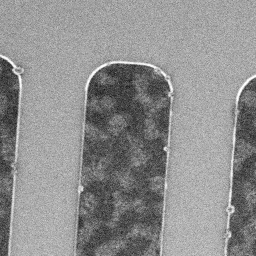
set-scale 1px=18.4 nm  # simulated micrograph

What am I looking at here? one or a few lines or trenches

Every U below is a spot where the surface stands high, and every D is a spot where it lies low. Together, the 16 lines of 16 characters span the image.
DDDDDDDDDDDDDDDD
DDDDDDDDDDDDDDDD
DDDDDDDDDDDDDDDD
DDDDDDDDDDDDDDDD
UDDDDDUUUUDDDDDD
UDDDDUUUUUUDDDDU
UDDDDUUUUUUDDDDU
UDDDDUUUUUUDDDDU
UDDDDUUUUUUDDDDU
UDDDDUUUUUUDDDDU
UDDDDUUUUUDDDDDU
UDDDDUUUUUDDDDUU
UDDDDUUUUUDDDDUU
UDDDDUUUUUDDDDUU
UDDDDUUUUUDDDDUU
UDDDDUUUUUDDDDUU